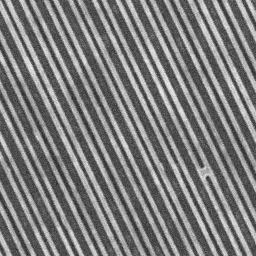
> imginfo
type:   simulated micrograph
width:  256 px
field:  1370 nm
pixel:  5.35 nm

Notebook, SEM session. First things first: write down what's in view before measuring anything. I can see parallel lines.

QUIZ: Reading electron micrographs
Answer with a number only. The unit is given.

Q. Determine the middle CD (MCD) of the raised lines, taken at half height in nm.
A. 20.5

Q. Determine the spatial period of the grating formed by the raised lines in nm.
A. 58